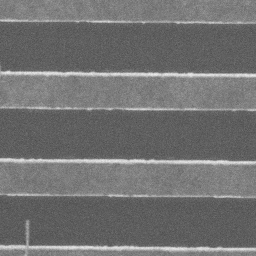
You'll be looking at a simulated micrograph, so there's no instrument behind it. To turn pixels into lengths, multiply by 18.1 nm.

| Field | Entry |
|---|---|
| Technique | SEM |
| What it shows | lines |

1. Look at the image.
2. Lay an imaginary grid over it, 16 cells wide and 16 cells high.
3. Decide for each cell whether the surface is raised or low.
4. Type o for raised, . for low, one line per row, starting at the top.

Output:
oooooooooooooooo
................
................
................
o...............
oooooooooooooooo
oooooooooooooooo
................
................
................
oooooooooooooooo
oooooooooooooooo
................
................
................
ooooooooooo.....